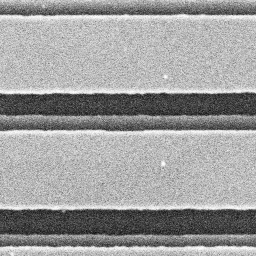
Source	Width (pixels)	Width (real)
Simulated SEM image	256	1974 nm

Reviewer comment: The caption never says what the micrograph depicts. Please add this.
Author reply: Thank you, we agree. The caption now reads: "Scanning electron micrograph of lines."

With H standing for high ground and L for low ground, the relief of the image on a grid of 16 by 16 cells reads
LLLLLLLLLLLLLLLL
HHHHHHHHHHHHHHHH
HHHHHHHHHHHHHHHH
HHHHHHHHHHHHHHHH
HHHHHHHHHHHHHHHH
HHHHHHHHHHHHHHHH
LLLLLLLLLLLLLLLL
LLLLLLLLLLLLLLLL
HHHHHHHHHHHHHHHH
HHHHHHHHHHHHHHHH
HHHHHHHHHHHHHHHH
HHHHHHHHHHHHHHHH
HHHHHHHHHHHHHHHH
LLLLLLLLLLLLLLLL
LLLLLLLLLLLLLLLL
HHHHHHHHHHHHHHHH